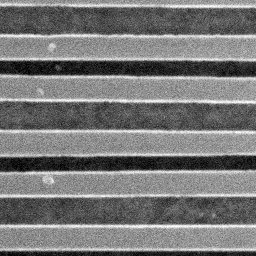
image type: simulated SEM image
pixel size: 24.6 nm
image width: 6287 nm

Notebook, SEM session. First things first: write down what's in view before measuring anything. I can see lines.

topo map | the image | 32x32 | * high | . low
********************************
................................
................................
................................
*****..******...................
********************************
********************************
.............................***
................................
***.............................
********************************
********************************
...*****************************
................................
................................
................................
********************************
********************************
********************************
*******..***....................
................................
................****************
********************************
********************************
**************..................
................................
................................
................................
********************************
********************************
********************************
................................